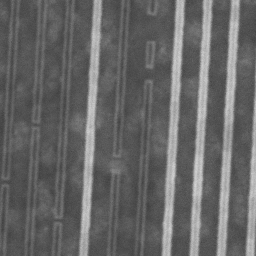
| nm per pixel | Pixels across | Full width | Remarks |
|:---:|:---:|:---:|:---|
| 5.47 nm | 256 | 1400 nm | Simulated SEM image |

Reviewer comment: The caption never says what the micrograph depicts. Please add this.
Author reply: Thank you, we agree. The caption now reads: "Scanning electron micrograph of parallel lines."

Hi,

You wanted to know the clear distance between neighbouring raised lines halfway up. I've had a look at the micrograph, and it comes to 0.119 microns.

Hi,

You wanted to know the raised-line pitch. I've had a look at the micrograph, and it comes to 150 nm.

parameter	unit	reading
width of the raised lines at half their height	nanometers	32.1